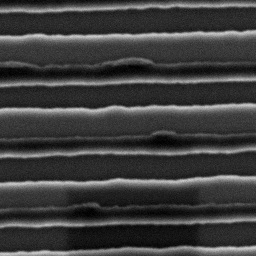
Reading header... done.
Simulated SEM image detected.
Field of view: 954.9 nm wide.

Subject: lines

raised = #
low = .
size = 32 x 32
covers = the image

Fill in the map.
################################
................................
................................
................................
...###.#.#.#####################
################################
################################
################################
################################
################################
###..##.........................
................................
................................
.............###################
################################
################################
################################
################################
################################
#####...........................
................................
................................
..............##......##########
################################
################################
################################
################################
##############################..
................................
................................
................................
..#.############################